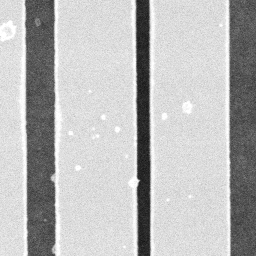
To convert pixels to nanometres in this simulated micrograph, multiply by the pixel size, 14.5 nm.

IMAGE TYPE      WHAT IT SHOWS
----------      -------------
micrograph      lines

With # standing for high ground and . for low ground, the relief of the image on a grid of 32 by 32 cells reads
###....##########..##########...
###....##########..##########...
###....##########..##########...
###....##########..##########...
###....##########..##########...
###....##########..##########...
###....##########..##########...
###....##########..##########...
###....##########..##########...
###....##########..##########...
###....##########..##########...
###....##########..##########...
###....##########..##########...
###....##########..##########...
###....##########..##########...
###....##########..##########...
###....##########..##########...
###....##########..##########...
###....##########..##########...
###....##########..##########...
###....##########..##########...
###....##########..##########...
###....##########..##########...
###....##########..##########...
###....##########..##########...
###....##########..##########...
###....##########..##########...
###....##########..##########...
###....##########..##########...
###....##########..##########...
###....##########..##########...
###....##########..##########...